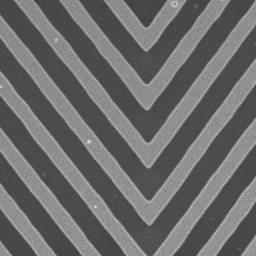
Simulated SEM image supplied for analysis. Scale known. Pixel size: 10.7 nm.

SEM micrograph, groups of lines, slits or small figures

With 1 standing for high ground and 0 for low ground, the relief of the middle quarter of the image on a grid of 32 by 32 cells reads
01111000000011111000000001111000
00111100000001111100000011110000
00111110000001111100000111110000
00011111000000111110001111100000
00001111100000011111001111000000
00000111100000001111111111000000
00000111110000001111111110000001
00000011111000000111111100000011
10000001111100000011111000000011
10000000111100000001111000000111
11000000111110000001110000001111
11100000011111000000000000011111
11110000001111100000000000011111
11110000000111110000000000111110
01111000000011111000000001111100
01111100000011111000000001111000
00111110000001111100000011110000
00011111000000111110000111110000
00001111000000011111001111100000
00000111100000001111001111000000
00000111110000001111111110000000
00000011111000000111111110000001
00000001111100000011111100000011
10000001111100000001111000000011
11000000111110000000111000000111
11100000011111000000110000001111
11110000001111100000000000001111
11110000000111100000000000011110
11111000000011110000000000111110
01111100000011111000000001111100
00111110000001111100000001111000
00011110000000111110000011110000